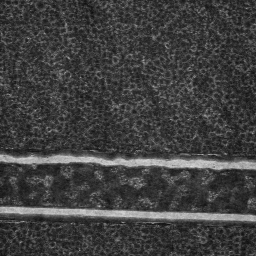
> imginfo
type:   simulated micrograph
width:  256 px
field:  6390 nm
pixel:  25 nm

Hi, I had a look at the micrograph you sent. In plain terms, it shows one or a few lines or trenches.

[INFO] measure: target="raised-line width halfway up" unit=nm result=1280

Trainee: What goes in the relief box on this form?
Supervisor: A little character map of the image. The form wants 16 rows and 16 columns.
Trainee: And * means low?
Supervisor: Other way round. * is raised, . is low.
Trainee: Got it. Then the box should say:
................
................
................
................
................
................
................
................
................
................
****************
****************
****************
.............***
................
................